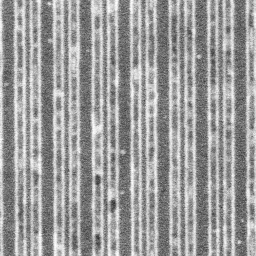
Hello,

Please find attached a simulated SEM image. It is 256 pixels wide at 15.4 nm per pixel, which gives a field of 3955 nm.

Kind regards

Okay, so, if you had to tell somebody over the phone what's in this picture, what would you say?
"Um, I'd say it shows parallel lines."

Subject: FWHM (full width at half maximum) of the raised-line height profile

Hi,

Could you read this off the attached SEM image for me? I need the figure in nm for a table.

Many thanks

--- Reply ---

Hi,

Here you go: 124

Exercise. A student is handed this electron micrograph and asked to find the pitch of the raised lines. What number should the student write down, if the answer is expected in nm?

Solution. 294